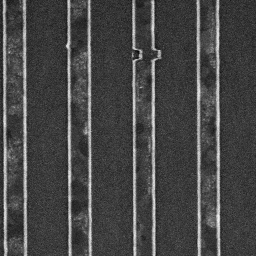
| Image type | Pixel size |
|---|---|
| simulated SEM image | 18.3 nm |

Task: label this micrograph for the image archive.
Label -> one or a few lines or trenches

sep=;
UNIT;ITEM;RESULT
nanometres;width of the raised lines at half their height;381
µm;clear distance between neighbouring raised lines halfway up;0.797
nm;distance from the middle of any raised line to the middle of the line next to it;1180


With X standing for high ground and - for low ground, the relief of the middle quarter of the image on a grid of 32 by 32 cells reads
-XXXXX-----------XXXXX----------
-XXXXX-----------XXXXX----------
-XXXXX-----------XXXXX----------
-XXXXX-----------XXXXX----------
-XXXXX-----------XXXXX----------
-XXXXX-----------XXXXX----------
-XXXXX-----------XXXXX----------
-XXXXX-----------XXXXX----------
-XXXXX-----------XXXXX----------
-XXXXX-----------XXXXX----------
-XXXXX-----------XXXXX----------
-XXXXX-----------XXXXX----------
-XXXXX-----------XXXXX----------
-XXXXXX----------XXXXX----------
-XXXXXX----------XXXXX----------
-XXXXX-----------XXXXX----------
-XXXXXX----------XXXXX----------
-XXXXX-----------XXXXX----------
-XXXXXX----------XXXXX----------
-XXXXXX----------XXXXX----------
-XXXXXX----------XXXXX----------
-XXXXXX----------XXXXX----------
-XXXXXX----------XXXXX----------
-XXXXXX----------XXXXX----------
-XXXXXX----------XXXXX----------
-XXXXXX----------XXXXX----------
-XXXXXX----------XXXXX----------
-XXXXXX----------XXXXX----------
-XXXXXX----------XXXXX----------
-XXXXX------------XXXX----------
-XXXXXX-----------XXXX----------
-XXXXXX-----------XXXX----------